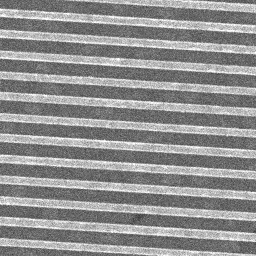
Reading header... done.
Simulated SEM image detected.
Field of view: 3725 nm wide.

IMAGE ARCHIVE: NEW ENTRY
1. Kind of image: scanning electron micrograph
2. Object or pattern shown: parallel lines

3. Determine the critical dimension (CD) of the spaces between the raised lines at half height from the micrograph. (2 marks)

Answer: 202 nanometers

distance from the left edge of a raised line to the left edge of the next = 0.302 microns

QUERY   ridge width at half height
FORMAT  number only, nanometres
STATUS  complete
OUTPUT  102